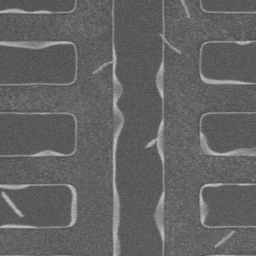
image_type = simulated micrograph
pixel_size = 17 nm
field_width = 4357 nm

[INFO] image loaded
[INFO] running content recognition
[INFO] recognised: groups of lines, slits or small figures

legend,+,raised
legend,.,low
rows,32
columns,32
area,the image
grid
++++++++++....++++++.....+++++++
...++++++.....++++++......++++++
..............++++++............
..............++++++............
..............+++++++...........
++....+++.....+++++++....+++++++
++++++++++....++++++.....+++++++
++++++++++....++++++.....+++++++
++++++++++....++++++.....+++++++
++++++++++....++++++.....+++++++
+++++++++.....++++++...........+
...............+++++............
..............++++++............
..............++++++............
+++++++++......+++++.....+++++++
++++++++++.....+++++.....+++++++
++++++++++.....+++++.....+++++++
++++++++++....++++++.....+++++++
++++++++++....++++++......++++++
..............++++++............
..............++++++............
..............++++++............
..............++++++............
+++++++++.....++++++.....+++++++
+++++++++.....++++++.....+++++++
+++++++++.....++++++.....+++++++
+++++++++.....++++++.....+++++++
+++++++++.....++++++.....+++++++
..............++++++............
..............++++++............
..............++++++............
..............++++++............